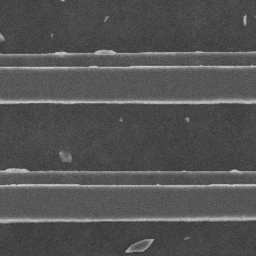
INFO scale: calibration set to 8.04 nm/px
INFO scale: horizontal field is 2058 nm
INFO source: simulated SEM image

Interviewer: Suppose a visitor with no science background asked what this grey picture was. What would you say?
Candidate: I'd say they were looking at lines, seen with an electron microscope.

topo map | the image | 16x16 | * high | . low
................
................
................
****************
****************
****************
................
................
................
................
................
****************
****************
****************
................
................